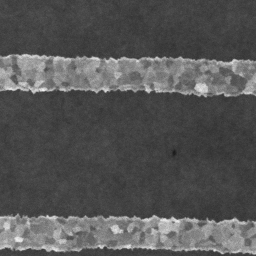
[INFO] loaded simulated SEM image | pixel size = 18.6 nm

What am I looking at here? one or a few lines or trenches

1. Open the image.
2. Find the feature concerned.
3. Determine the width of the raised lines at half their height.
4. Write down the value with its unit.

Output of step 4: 585 nanometres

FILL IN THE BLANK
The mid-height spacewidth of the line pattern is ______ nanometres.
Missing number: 2370